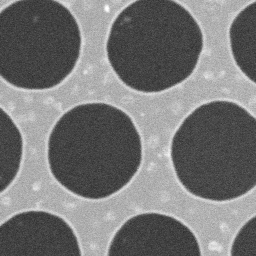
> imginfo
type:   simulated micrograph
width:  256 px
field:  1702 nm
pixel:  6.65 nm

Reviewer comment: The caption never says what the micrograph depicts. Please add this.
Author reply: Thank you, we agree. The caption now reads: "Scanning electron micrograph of holes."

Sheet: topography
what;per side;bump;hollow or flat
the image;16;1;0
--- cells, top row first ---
0000111100001110
0000011000001100
0000011000000100
0000011000001110
0000111000001110
1001111100011111
1111100111111001
0111000011110000
0110000001100000
0110000001100000
0110000001100000
0111000011100000
1111111111111011
1000111100011111
0000011000001110
0000011000001100